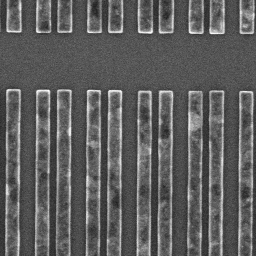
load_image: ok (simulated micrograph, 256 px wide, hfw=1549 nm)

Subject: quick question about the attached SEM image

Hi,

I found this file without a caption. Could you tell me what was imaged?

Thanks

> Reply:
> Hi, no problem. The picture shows wiring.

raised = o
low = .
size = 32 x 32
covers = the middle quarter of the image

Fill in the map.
................................
................................
................................
................................
................................
................................
................................
oo....ooo..ooo.....ooo..ooo.....
oo....ooo..ooo.....ooo..ooo....o
oo....ooo..ooo.....ooo..ooo....o
oo....ooo..ooo.....ooo..ooo....o
oo....ooo..ooo.....ooo..ooo....o
oo....ooo..ooo.....ooo..ooo....o
oo....ooo..ooo.....ooo..ooo....o
oo....ooo..ooo.....ooo..ooo....o
oo....ooo..ooo.....ooo..ooo....o
o.....ooo..ooo.....ooo..ooo....o
o.....ooo..ooo.....ooo..ooo....o
oo....ooo..ooo.....ooo..ooo....o
oo....ooo..ooo.....ooo..ooo....o
oo....ooo..ooo.....ooo..ooo....o
oo....ooo..ooo.....ooo..ooo....o
oo....ooo..ooo.....ooo..ooo....o
oo....ooo..ooo.....ooo..ooo....o
o.....ooo..ooo.....ooo..ooo....o
o.....ooo..ooo.....ooo..ooo....o
o.....ooo..ooo.....ooo..ooo....o
o.....ooo..ooo.....ooo..ooo....o
o.....ooo..ooo.....oo...ooo....o
o.....ooo..ooo.....oo...ooo....o
o.....ooo..ooo.....oo...ooo....o
o.....ooo..ooo.....oo...ooo....o